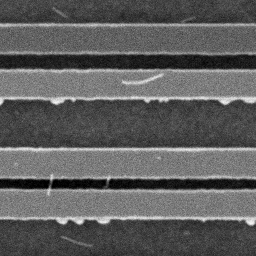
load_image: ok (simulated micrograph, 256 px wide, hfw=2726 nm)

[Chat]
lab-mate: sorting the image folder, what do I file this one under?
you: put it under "lines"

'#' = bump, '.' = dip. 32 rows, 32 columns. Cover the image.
................................
................................
................................
################################
################################
################################
################################
................................
................................
################################
################################
################################
#.....##...................##..#
................................
................................
................................
................................
................................
................................
################################
################################
################################
................................
................................
################################
################################
################################
.......#.##.##.................#
................................
................................
................................
................................